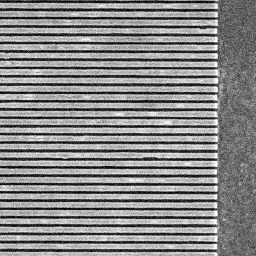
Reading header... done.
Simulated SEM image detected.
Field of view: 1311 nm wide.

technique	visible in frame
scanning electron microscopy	parallel lines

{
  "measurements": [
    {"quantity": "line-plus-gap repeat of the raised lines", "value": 0.0422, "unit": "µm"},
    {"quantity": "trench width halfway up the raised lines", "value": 0.0135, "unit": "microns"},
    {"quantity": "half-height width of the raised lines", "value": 26.3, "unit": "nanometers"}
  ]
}